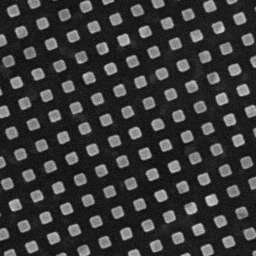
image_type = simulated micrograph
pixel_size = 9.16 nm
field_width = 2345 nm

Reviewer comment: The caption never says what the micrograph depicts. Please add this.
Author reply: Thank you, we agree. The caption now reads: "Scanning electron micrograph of a regular array of raised bodies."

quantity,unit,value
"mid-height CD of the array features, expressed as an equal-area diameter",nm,106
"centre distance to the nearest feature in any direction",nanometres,204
